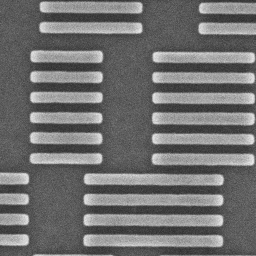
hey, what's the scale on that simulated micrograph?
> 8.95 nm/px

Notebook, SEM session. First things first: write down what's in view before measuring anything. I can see wiring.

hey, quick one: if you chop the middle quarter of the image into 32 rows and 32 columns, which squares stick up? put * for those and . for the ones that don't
................................
................................
*********..............*********
*********.............**********
*********..............*********
................................
................................
*********.............**********
*********.............**********
.......................*********
................................
................................
*********.............**********
*********.............**********
*********.............**********
................................
................................
*********..............*****....
*********.............**********
*********.............**********
................................
................................
*********..............*********
*********.............**********
*********.............**********
................................
................................
................................
.....***************************
.....***************************
................................
................................